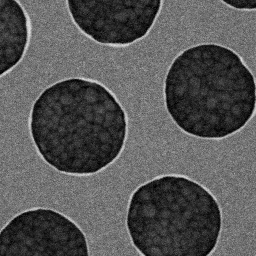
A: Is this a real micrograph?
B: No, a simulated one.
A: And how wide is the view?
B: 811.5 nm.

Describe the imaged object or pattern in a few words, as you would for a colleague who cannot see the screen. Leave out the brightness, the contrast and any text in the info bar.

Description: holes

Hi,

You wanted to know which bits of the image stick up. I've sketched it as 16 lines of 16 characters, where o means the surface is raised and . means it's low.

.ooo......ooooo.
..ooo....ooooooo
..oooo..oooooooo
.oooooooooo....o
ooooooooooo.....
ooo...oooo......
oo.....ooo......
oo......ooo.....
oo......oooo..oo
oo.....ooooooooo
ooo...oooooooooo
ooooooooo...oooo
oooooooo.....ooo
o...oooo......oo
.....ooo......oo
.....oooo....ooo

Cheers